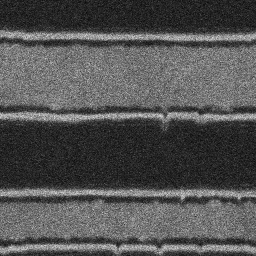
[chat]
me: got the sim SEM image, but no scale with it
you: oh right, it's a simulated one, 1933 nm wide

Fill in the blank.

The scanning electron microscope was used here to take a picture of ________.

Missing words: one or a few lines or trenches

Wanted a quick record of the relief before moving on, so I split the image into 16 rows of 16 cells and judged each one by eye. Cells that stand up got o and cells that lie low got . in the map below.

oooooooooooooooo
oooooooooooooooo
................
................
................
................
................
oooooooooooooooo
oooooooooooooooo
oooooooooooooooo
oooooooooooooooo
oooooooooooooooo
................
................
................
.oooooooo.oooo..